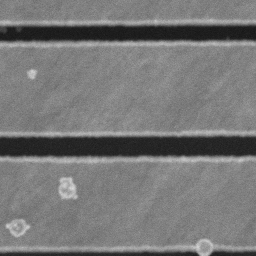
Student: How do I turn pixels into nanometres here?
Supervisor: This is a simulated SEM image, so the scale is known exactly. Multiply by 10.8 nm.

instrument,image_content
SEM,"lines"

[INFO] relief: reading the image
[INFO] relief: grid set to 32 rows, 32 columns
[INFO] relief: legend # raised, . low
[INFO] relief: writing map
################################
################################
################################
................................
................................
################################
################################
################################
################################
################################
################################
################################
################################
################################
################################
################################
################################
................................
................................
...............................#
################################
################################
################################
################################
################################
################################
################################
################################
################################
################################
################################
........................###.....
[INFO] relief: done